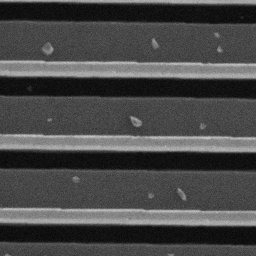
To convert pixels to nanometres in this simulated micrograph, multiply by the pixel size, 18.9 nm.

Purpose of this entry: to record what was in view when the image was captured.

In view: lines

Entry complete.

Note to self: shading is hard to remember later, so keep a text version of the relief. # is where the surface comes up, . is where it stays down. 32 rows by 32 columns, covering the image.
..............................##
................................
................................
################################
################################
################################
################################
################################
################################
################################
................................
................................
##############################..
################################
################################
################################
################################
################################
################################
................................
................................
###################.............
################################
################################
################################
################################
################################
################################
................................
................................
##########......................
################################